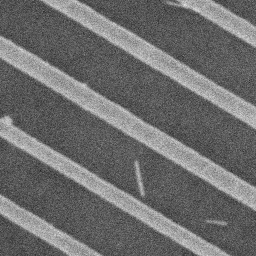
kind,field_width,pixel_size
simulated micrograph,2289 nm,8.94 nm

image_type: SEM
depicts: lines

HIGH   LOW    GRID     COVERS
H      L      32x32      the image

LLLLLLHHHHLLLLLLLLLLLLLHHHHLLLLL
LLLLLLLLHHHHLLLLLLLLLLLLLHHHHLLL
LLLLLLLLLHHHHHLLLLLLLLLLLLHHHHHL
LLLLLLLLLLLHHHHLLLLLLLLLLLLLHHHH
LLLLLLLLLLLLLHHHHLLLLLLLLLLLLLHH
HHLLLLLLLLLLLLHHHHHLLLLLLLLLLLLH
HHHLLLLLLLLLLLLLHHHHLLLLLLLLLLLL
LHHHHLLLLLLLLLLLLLHHHHLLLLLLLLLL
LLHHHHHLLLLLLLLLLLLHHHHHLLLLLLLL
LLLLHHHHHLLLLLLLLLLLLHHHHLLLLLLL
LLLLLLHHHHLLLLLLLLLLLLLHHHHLLLLL
LLLLLLLHHHHHLLLLLLLLLLLLHHHHHLLL
LLLLLLLLLHHHHHLLLLLLLLLLLLHHHHLL
LLLLLLLLLLHHHHHLLLLLLLLLLLLLHHHH
LLLLLLLLLLLLHHHHHLLLLLLLLLLLLLHH
HHLLLLLLLLLLLLHHHHLLLLLLLLLLLLLH
HHHLLLLLLLLLLLLLHHHHLLLLLLLLLLLL
LHHHLLLLLLLLLLLLLHHHHHLLLLLLLLLL
LLLHHHLLLLLLLLLLLLLHHHHHLLLLLLLL
LLLLHHHHLLLLLLLLLLLLLHHHHLLLLLLL
LLLLLLHHHHLLLLLLLLLLLLHHHHHLLLLL
LLLLLLLLHHHLLLLLLLLLLLLLHHHHHLLL
LLLLLLLLLHHHHLLLLLLLLLLLLLHHHHLL
LLLLLLLLLLLHHHLLLLLLLLLLLLLHHHHH
LLLLLLLLLLLLLHHHLLLLLLLLLLLLLHHH
HHLLLLLLLLLLLLHHHHLLLLLLLLLLLLLH
HHHHLLLLLLLLLLLLHHHHLLLLLLLLLLLL
LHHHHLLLLLLLLLLLLLHHHLLLLLLLLLLL
LLLHHHHLLLLLLLLLLLLHHHHLLLLLLLLL
LLLLLHHHHLLLLLLLLLLLLHHHHLLLLLLL
LLLLLLHHHHLLLLLLLLLLLLLHHHLLLLLL
LLLLLLLLHHHHLLLLLLLLLLLLHHHHLLLL